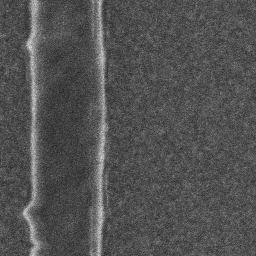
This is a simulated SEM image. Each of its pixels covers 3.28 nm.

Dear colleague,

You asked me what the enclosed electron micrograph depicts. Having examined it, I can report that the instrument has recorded one or a few lines or trenches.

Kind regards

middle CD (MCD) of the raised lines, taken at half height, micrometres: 0.228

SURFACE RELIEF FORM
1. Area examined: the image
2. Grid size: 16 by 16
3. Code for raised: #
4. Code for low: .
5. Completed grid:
..####..........
..####..........
..####..........
..####..........
..####..........
..#####.........
..####..........
..####..........
..####..........
..####..........
..####..........
..####..........
..####..........
..####..........
..####..........
..####..........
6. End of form